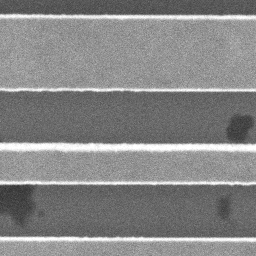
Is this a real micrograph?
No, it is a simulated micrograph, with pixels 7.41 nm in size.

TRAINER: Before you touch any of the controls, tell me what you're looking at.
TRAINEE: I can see lines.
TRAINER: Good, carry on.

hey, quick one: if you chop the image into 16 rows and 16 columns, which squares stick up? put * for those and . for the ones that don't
................
****************
****************
****************
****************
****************
................
................
................
****************
****************
..............**
................
................
................
****************